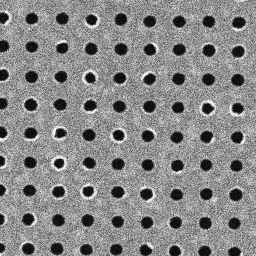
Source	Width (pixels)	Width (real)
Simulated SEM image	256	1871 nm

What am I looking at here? a regular array of holes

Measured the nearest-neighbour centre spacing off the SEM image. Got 0.208 µm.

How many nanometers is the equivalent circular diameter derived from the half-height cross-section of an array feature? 89.8